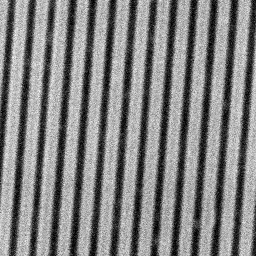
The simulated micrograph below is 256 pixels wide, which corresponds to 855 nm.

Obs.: parallel lines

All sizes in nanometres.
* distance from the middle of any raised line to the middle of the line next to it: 67.3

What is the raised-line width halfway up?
0.0379 microns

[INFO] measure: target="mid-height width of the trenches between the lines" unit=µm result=0.0291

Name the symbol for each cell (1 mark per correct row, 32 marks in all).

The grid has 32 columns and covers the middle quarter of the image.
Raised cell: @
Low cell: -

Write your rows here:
--@@@--@@@--@@@--@@@--@@@--@@@--
--@@@--@@@--@@@--@@@--@@@--@@@--
--@@@--@@@--@@@--@@@--@@@--@@@--
--@@---@@---@@@--@@@--@@@--@@@--
--@@---@@---@@@--@@@--@@@--@@@--
--@@---@@---@@@--@@@--@@@--@@@--
--@@---@@---@@---@@@--@@@--@@@--
-@@@---@@---@@---@@---@@---@@---
-@@@---@@--@@@---@@---@@---@@---
-@@@---@@--@@@---@@---@@---@@---
-@@@---@@--@@@---@@---@@---@@---
-@@@--@@@--@@@--@@@--@@@---@@---
-@@@--@@@--@@@--@@@--@@@--@@@--@
-@@@--@@@--@@@--@@@--@@@--@@@--@
-@@@--@@@--@@@--@@@--@@@--@@@--@
-@@@--@@@--@@@--@@@--@@@--@@@--@
-@@---@@---@@@--@@@--@@@--@@@--@
-@@---@@---@@@--@@@--@@@--@@@--@
-@@---@@---@@@--@@@--@@@--@@@--@
-@@---@@---@@---@@---@@@--@@@--@
@@@---@@---@@---@@---@@---@@---@
@@@---@@--@@@---@@---@@---@@---@
@@@---@@--@@@---@@---@@---@@---@
@@@--@@@--@@@---@@---@@---@@---@
@@@--@@@--@@@--@@@--@@@--@@@---@
@@@--@@@--@@@--@@@--@@@--@@@--@@
@@@--@@@--@@@--@@@--@@@--@@@--@@
@@@--@@@--@@@--@@@--@@@--@@@--@@
@@---@@@--@@@--@@@--@@@--@@@--@@
@@---@@---@@@--@@@--@@@--@@@--@@
@@---@@---@@@--@@@--@@@--@@@--@@
@@---@@---@@@--@@@--@@@--@@@--@@